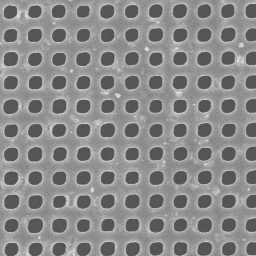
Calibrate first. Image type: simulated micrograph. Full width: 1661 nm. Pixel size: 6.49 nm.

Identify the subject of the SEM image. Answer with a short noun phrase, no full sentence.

a regular array of holes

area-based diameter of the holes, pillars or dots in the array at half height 92.2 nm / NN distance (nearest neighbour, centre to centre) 153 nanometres